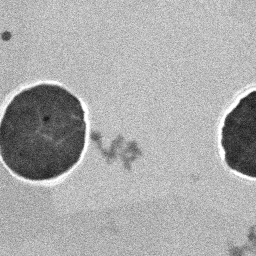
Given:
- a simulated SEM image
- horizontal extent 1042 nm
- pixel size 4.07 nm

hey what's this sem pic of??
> holes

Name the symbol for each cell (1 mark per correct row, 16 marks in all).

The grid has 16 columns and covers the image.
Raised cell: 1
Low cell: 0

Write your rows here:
1111111111111111
1111111111111111
1111111111111111
1111111111111111
1111111111111111
1100111111111111
1000011111111110
0000011111111100
0000011111111100
0000011111111100
1000111111111110
1111111111111111
1111111111111111
1111111111111111
1111111111111111
1111111111111111